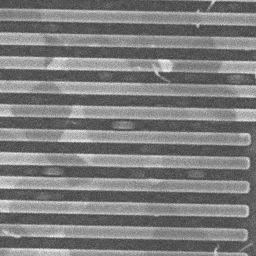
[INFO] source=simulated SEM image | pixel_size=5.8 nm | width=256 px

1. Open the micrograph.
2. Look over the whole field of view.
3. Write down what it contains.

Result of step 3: parallel lines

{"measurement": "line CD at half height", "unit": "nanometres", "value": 68.9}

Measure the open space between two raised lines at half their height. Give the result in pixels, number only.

12.6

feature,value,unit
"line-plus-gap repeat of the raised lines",139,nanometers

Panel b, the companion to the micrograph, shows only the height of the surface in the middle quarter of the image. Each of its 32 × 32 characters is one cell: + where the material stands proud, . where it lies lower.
++++++++++++++++++++++++++++++++
............++++++++++++++++++++
..........+.....................
...............................+
................................
++++++++++++++++++++++++++++++++
++++++++++++++++++++++++++++++++
...............+++++++++++++++++
................................
................................
................................
++++++++++++++++++++++++++++++++
++++++++++++++++++++++++++++++++
.............+++++++++++++++++++
.............+++................
............+++++...............
................................
++++++++++++++++++++++++++++++++
++++++++++++++++++++++++++++++++
...........+++++++++++++++++++++
................................
................................
+...............................
++++++++++++++++++++++++++++++++
++++++++++++++++++++++++++++++++
...............+++++++++++++++++
................................
................................
................................
++++++++++++++++++++++++++++++++
++++++++++++++++++++++++++++++++
..................++++++++++++++